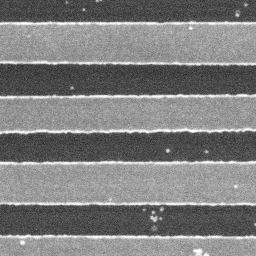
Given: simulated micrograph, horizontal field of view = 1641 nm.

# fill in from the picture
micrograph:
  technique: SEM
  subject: lines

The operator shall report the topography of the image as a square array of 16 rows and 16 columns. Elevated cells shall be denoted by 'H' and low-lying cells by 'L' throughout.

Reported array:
LLLLLLLLLLLLLLLL
HHHHHHHHHHHHHHHH
HHHHHHHHHHHHHHHH
HHHHHHHHHHHHHHHH
LLLLLLLLLLLLLLLL
LLLLLLLLLLLLLLLL
HHHHHHHHHHHHHHHH
HHHHHHHHHHHHHHHH
LLLLLLLLLLLLLLLL
LLLLLLLLLLLLLLLL
HHHHHHHHHHHHHHHH
HHHHHHHHHHHHHHHH
HHHHHHHHHHHHHHHH
LLLLLLLLLLLLLLLL
LLLLLLLLLLLLLLLL
HHHHHHHHHHHHHHHH